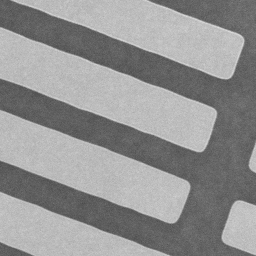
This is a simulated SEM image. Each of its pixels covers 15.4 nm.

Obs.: groups of lines, slits or small figures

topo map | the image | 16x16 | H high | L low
LLHHHHHHHHLLLLLL
LLLLLHHHHHHHHLLL
HHLLLLLHHHHHHHHL
HHHHHLLLLLHHHHHL
HHHHHHHLLLLLLHHL
LLHHHHHHHHLLLLLL
LLLLHHHHHHHHHLLL
HHLLLLLHHHHHHLLL
HHHHLLLLLLHHHLLL
HHHHHHHLLLLLLLLL
LHHHHHHHHHLLLLLL
LLLLHHHHHHHHLLLL
HLLLLLLHHHHHLLLL
HHHHLLLLLHHLLLHH
HHHHHHHLLLLLLLHH
LHHHHHHHHLLLLLLH